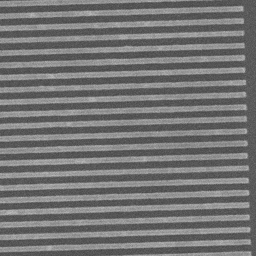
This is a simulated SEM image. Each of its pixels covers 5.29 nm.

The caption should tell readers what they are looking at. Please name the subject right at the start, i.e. parallel lines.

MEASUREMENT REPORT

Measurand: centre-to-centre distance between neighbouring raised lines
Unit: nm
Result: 64.9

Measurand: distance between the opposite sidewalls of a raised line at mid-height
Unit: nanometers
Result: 29.1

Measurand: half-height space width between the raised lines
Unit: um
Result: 0.039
